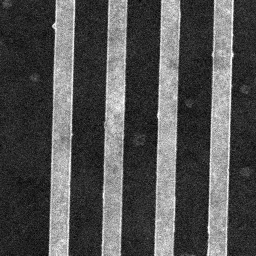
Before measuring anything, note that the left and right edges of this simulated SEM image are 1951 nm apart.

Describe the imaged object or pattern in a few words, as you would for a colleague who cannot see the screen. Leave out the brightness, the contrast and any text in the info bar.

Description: parallel lines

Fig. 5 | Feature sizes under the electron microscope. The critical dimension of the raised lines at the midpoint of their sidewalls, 139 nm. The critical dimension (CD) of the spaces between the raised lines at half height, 263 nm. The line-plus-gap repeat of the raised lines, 403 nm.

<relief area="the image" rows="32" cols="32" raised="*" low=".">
.......**.....**....**.....**...
.......**.....**....**.....**...
.......**.....**....**.....**...
.......**.....**....**.....**...
.......**.....**....**.....**...
.......**.....**....**.....**...
.......**....***....**.....**...
.......**....***....**.....**...
.......**....***....**.....**...
.......**....***....**.....**...
.......**....***....**.....**...
.......**....***....**.....**...
.......**....**.....**.....**...
.......**....**.....**.....**...
.......**....**.....**....***...
.......**....**.....**....***...
.......**....**.....**....***...
.......**....**.....**....***...
.......**....**.....**....***...
.......**....**.....**....**....
.......**....**.....**....**....
......***....**.....**....**....
......***....**.....**....**....
......***....**.....**....**....
......***....**.....**....**....
......***....**.....**....**....
......***....**.....**....**....
......***....**.....**....**....
......**.....**....***....**....
......**.....**....***....**....
......**.....**....***....**....
......**.....**....***....**....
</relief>